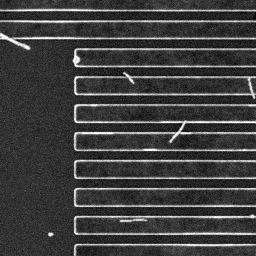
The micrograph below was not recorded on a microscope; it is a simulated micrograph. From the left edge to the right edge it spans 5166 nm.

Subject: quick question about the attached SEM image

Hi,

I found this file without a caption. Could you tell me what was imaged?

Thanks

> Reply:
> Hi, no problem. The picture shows groups of lines, slits or small figures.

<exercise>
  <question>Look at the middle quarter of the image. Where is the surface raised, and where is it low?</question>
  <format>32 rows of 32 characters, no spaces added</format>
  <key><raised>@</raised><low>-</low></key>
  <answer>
---@@@@@@@@@@@@@@@@@@@@@@@@@@@@@
--------------------------------
--------------------------------
---@@@@@@@@@@@@@@@@@@@@@@@@@@@@@
---@@@@@@@@@@@@@@@@@@@@@@@@@@@@@
---@@@@@@@@@@@@@@@@@@@@@@@@@@@@@
---@@@@@@@@@@@@@@@@@@@@@@@@@@@@@
---@@@@@@@@@@@@@@@@@@@@@@@@@@@@@
--------------------------------
--------------------------------
---@@@@@@@@@@@@@@@@@@@@@@@@@@@@@
---@@@@@@@@@@@@@@@@@@@@@@@@@@@@@
---@@@@@@@@@@@@@@@@@@@@@@@@@@@@@
---@@@@@@@@@@@@@@@@@@@@@@@@@@@@@
---@@@@@@@@@@@@@@@@@@@@@@@@@@@@@
--------------------------------
--------------------------------
---@@@@@@@@@@@@@@@@@@@@@@@@@@@@@
---@@@@@@@@@@@@@@@@@@@@@@@@@@@@@
---@@@@@@@@@@@@@@@@@@@@@@@@@@@@@
---@@@@@@@@@@@@@@@@@@@@@@@@@@@@@
--------------------------------
--------------------------------
--------------------------------
---@@@@@@@@@@@@@@@@@@@@@@@@@@@@@
---@@@@@@@@@@@@@@@@@@@@@@@@@@@@@
---@@@@@@@@@@@@@@@@@@@@@@@@@@@@@
---@@@@@@@@@@@@@@@@@@@@@@@@@@@@@
--------------------------------
--------------------------------
--------------------------------
---@@@@@@@@@@@@@@@@@@@@@@@@@@@@@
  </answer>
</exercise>